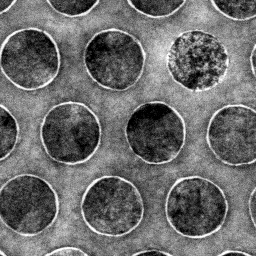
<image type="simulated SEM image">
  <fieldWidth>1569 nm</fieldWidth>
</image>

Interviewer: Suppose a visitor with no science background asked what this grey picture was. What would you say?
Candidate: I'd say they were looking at raised bodies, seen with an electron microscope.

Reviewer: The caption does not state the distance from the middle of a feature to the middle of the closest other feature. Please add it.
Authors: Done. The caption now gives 514 nm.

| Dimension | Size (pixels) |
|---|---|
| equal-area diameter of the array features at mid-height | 60.5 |